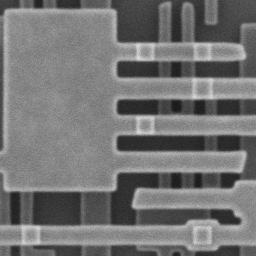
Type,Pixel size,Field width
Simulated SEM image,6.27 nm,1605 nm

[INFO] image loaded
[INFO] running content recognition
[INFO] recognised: wiring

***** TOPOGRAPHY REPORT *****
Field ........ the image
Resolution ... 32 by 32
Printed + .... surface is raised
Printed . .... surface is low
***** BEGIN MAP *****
................................
.+++++++++++++..................
.++++++++++++++.................
.+++++++++++++..................
.++++++++++++++.................
.++++++++++++++++++++++++++++...
.++++++++++++++++++++++++++++++.
.+++++++++++++++++++++++++++++..
.++++++++++++++.................
.++++++++++++++.................
.+++++++++++++++++++++++++++++++
.+++++++++++++++++++++++++++++++
.++++++++++++++.................
.++++++++++++++.................
.+++++++++++++++++++++++++++++++
.+++++++++++++++++++++++++++++++
++++++++++++++++++++++++++++++++
.++++++++++++++.................
+++++++++++++++.................
+++++++++++++++++++++++++++++++.
+++++++++++++++++++++++++++++++.
+++++++++++++++..............+..
.++++++++++++++.................
.+++++++++++++...............+++
.................+++++++++++++++
.................+++++++++++++++
.............................+++
..............................++
++++++++++++++++++++++++++++++++
++++++++++++++++++++++++++++++++
++++++++++++++++++++++++++++++++
................................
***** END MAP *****